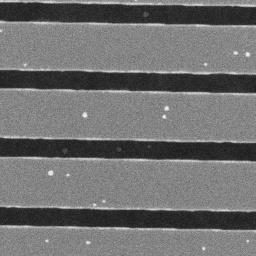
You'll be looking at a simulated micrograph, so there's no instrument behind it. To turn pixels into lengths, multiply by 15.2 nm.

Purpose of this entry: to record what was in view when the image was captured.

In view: lines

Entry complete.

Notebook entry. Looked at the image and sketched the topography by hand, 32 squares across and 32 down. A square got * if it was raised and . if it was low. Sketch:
...............*****************
................................
................................
********************************
********************************
********************************
********************************
********************************
********************************
................................
................................
**********************..........
********************************
********************************
********************************
********************************
********************************
................****************
................................
................................
********************************
********************************
********************************
********************************
********************************
********************************
................................
................................
*****************...............
********************************
********************************
********************************